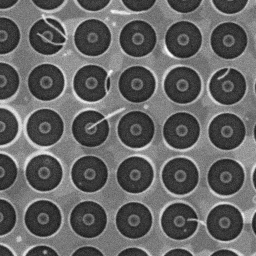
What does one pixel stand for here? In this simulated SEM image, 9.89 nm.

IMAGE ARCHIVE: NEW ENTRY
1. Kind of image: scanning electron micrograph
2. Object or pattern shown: an array of small figures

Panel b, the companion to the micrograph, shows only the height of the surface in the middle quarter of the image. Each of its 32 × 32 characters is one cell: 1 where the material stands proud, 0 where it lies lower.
11111000011111111001111111111011
11110000001111100000011111000000
11100000000111000000001111000000
11000000000111000000000110000000
11000000000011000000000110000000
11000000000011000000000110000000
11000000000111000000000110000000
11100000000111000000001110000000
11110000001111100000011111000000
11111100111111111000111111100000
11111111111111111111111111111111
11111001111111111111111111111111
11100000001111100000011111100000
11100000001111000000001111000000
11000000000111000000001110000000
11000000000110000000000110000000
11000000000110000000000110000000
11000000000110000000000110000000
11000000000111000000001110000000
11100000001111000000001110000000
11111000111111100000011111000000
11111111111111111111111111111011
11111111111111111111111111111111
11110000011111110000111111100001
11100000001111000000001111000000
11000000000111000000001110000000
11000000000110000000000100000000
11000000000110000000000100000000
11000000000110000000000100000000
11000000000110000000001110000000
11100000001111000000001110000000
11110000011111100000011111000000